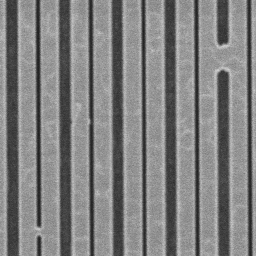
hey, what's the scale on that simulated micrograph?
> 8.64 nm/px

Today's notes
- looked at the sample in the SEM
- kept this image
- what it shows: parallel lines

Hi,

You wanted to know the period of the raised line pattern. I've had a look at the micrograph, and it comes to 0.228 microns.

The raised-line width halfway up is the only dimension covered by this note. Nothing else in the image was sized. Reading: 163 nm